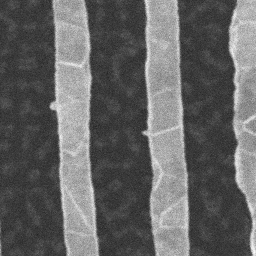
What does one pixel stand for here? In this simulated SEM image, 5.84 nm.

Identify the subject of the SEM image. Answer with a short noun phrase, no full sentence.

one or a few lines or trenches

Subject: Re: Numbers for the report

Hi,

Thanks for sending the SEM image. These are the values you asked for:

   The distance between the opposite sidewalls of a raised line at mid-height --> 187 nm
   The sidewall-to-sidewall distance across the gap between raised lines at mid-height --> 58.3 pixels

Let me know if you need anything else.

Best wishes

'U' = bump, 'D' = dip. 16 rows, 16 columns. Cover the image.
DDDUUDDDDUUDDDDU
DDDUUDDDDUUDDDUU
DDDDUUDDDUUDDDUU
DDDDUUDDDUUDDDDU
DDDDUUDDDUUDDDDU
DDDDUUDDDUUDDDDU
DDDUUUDDDUUDDDDU
DDDDUUDDDUUDDDDU
DDDDUUDDDUUDDDDU
DDDDUUDDDUUDDDDU
DDDDUUDDDDUUDDDU
DDDDUUDDDDUUDDDU
DDDDUUDDDUUUDDDU
DDDDUUDDDUUUDDDD
DDDDUUDDDDUUDDDD
DDDDUUDDDDUUDDDD